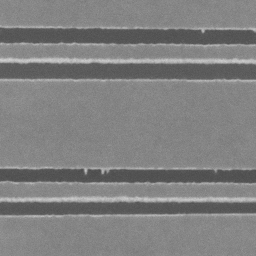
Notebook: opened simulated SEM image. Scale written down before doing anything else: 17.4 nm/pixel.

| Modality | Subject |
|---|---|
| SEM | lines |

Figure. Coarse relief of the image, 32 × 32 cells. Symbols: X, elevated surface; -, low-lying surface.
XXXXXXXXXXXXXXXXXXXXXXXXXXXXXXXX
XXXXXXXXXXXXXXXXXXXXXXXXXXXXXXXX
XXXXXXXXXXXXXXXXXXXXXXXXXXXXXXXX
-------XXXX-XXXXXXXXXXXXXXXXXXXX
--------------------------------
X-XX---X-X----------------------
XXXXXXXXXXXXXXXXXXXXXXXXXXXXXXXX
XXXXXXXXXXXXXXXXXXXXXXXXXXXXXXXX
--------------------------------
--------------------------------
XXXXXXXXXXXXXXXXXXXXXXXXXXXXXXXX
XXXXXXXXXXXXXXXXXXXXXXXXXXXXXXXX
XXXXXXXXXXXXXXXXXXXXXXXXXXXXXXXX
XXXXXXXXXXXXXXXXXXXXXXXXXXXXXXXX
XXXXXXXXXXXXXXXXXXXXXXXXXXXXXXXX
XXXXXXXXXXXXXXXXXXXXXXXXXXXXXXXX
XXXXXXXXXXXXXXXXXXXXXXXXXXXXXXXX
XXXXXXXXXXXXXXXXXXXXXXXXXXXXXXXX
XXXXXXXXXXXXXXXXXXXXXXXXXXXXXXXX
XXXXXXXXXXXXXXXXXXXXXXXXXXXXXXXX
XXXXXXXXXXXXXXXXXXXXXXXXXXXXXXXX
--------------------------------
--------------------------------
XXXXXXXXXXXXXXXXXXXXXXXXXXXXXXXX
XXXXXXXXXXXXXXXXXXXXXXXXXXXXXXXX
--------------------------------
--------------------------------
XXXXXXXXXXXXXXXXXXXXXXXXXXXXXXXX
XXXXXXXXXXXXXXXXXXXXXXXXXXXXXXXX
XXXXXXXXXXXXXXXXXXXXXXXXXXXXXXXX
XXXXXXXXXXXXXXXXXXXXXXXXXXXXXXXX
XXXXXXXXXXXXXXXXXXXXXXXXXXXXXXXX